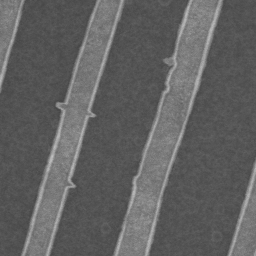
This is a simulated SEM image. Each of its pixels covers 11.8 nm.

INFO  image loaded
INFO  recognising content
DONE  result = one or a few lines or trenches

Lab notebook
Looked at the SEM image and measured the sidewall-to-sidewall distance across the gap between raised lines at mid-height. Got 798 nanometres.